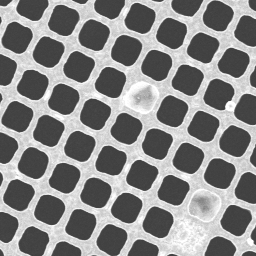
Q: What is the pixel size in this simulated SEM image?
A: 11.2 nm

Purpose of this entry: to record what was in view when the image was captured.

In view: a regular array of holes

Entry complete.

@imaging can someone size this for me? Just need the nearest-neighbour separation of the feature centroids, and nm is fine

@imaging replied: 384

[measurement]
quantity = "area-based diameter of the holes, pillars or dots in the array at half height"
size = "338 nanometres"